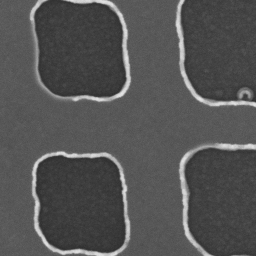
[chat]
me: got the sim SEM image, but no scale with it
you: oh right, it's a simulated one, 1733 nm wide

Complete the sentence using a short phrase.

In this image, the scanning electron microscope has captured holes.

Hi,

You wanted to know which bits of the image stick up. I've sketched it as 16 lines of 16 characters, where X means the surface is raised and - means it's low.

XX-----XXXX-----
XX------XXX-----
XX------XXX-----
XX------XXXX----
XX------XXXX----
XXX-----XXXX----
XXXXXXXXXXXXXXXX
XXXXXXXXXXXXXXXX
XXXXXXXXXXXXXXXX
XXXXXXXXXXXX----
XX-----XXXXX----
XX------XXXX----
XX------XXXX----
XX------XXXX----
XXX-----XXXX----
XXXX---XXXXXX---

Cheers